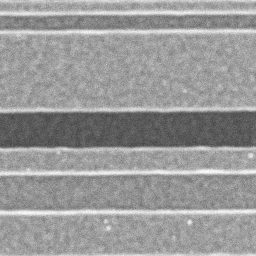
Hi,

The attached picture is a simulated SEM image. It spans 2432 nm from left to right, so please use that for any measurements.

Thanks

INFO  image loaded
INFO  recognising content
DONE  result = lines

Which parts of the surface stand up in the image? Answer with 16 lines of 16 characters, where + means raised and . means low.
++++++++++++++++
++++++++++++++++
++++++++++++++++
++++++++++++++++
++++++++++++++++
++++++++++++++++
++++++++++++++++
................
................
++++++++++++++++
++++++++++++++++
++++++++++++++++
++++++++++++++++
++++++++++++++++
++++++++++++++++
++++++++++++++++